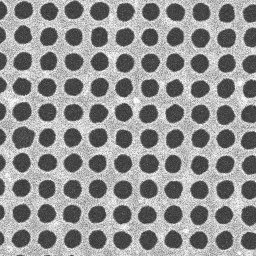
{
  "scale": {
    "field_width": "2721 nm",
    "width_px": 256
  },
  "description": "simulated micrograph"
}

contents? a regular array of holes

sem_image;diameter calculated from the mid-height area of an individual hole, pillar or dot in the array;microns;0.195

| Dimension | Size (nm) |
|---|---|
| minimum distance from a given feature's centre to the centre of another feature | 264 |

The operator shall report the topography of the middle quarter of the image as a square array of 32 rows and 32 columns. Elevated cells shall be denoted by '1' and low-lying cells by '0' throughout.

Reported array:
00000110000110000110000111000011
11011111001110000111000111100111
11111111111111111111111111111111
11011111111111111111111111111111
00000110000110000111000111000111
00000110000110000110000010000011
00001100000110000110000010000011
10011110000110001111000111000111
11111111111111111111111111111111
11111111111111111111111111111111
10001110001110001111000111100111
00000100000110000110000110000011
00000100000110000110000110000011
00001110000110000110000111000111
11111110001111111111001111001111
11111111111111111111111111111111
10011110001111011111101111100111
00001100000110000110000111000011
00000100000110000110000011000011
00001110000110000110000011000011
10011110001110001111000111000111
11111111111111111111111111111111
11011111111111111111111111111111
10001110000110000110000111000111
00000100000110000110000010000111
00001100000110000110000110000111
10001110001110001110000110000111
11111111111111111111111111111111
11111111111111111111111111111111
10001110001110001111001111000111
00001100000100000110000110000011
00001100000100000110000110000011